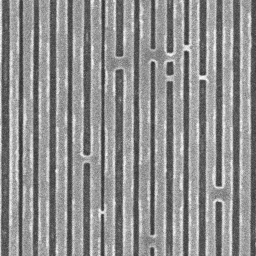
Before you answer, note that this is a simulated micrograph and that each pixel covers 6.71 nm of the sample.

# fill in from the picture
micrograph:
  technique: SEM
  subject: parallel lines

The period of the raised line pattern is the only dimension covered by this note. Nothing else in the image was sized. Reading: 111 nm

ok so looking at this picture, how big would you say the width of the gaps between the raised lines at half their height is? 0.0453 micrometres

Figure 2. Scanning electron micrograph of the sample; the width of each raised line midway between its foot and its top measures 0.0646 µm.